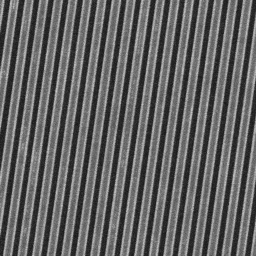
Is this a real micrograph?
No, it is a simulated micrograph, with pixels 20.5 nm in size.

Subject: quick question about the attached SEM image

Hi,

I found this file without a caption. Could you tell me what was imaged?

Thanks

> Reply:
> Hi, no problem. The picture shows parallel lines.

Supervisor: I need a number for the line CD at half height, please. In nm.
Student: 157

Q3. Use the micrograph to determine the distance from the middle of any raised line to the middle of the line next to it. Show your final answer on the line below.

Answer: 295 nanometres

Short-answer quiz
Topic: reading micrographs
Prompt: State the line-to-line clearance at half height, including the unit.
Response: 137 nm